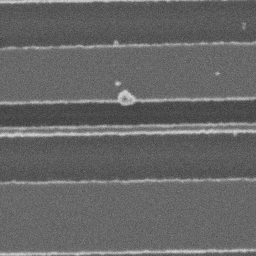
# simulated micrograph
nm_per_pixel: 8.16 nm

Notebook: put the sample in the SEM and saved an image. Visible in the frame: lines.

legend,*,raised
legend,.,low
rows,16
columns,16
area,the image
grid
................
................
................
****************
****************
****************
................
................
................
................
................
****************
****************
****************
****************
****************